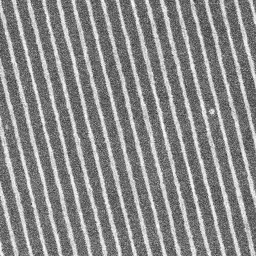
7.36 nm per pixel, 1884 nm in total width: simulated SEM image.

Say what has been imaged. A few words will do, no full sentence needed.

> parallel lines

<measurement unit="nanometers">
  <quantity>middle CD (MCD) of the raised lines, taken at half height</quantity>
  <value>21.4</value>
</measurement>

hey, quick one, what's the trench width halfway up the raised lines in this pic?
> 0.0859 micrometres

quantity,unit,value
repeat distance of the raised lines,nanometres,106